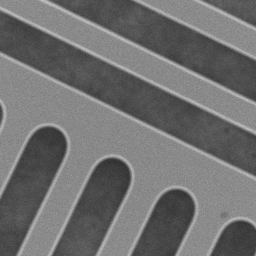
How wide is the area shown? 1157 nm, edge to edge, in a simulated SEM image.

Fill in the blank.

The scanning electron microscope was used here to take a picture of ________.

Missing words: groups of lines, slits or small figures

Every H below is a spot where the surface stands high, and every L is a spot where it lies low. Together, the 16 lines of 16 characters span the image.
HHHHLLLLLHHHHLLL
LLHHHHLLLLLHHHHL
LLLLHHHHLLLLLHHH
LLLLLLHHHHLLLLLL
HHLLLLLLHHHHLLLL
HHHHHLLLLLHHHHLL
HHHHHHHLLLLLHHHH
HHHHHHHHHLLLLLHH
HHLLHHHHHHHLLLLL
HLLLHHHHHHHHHLLL
HLLLHHLLHHHHHHHL
LLLHHLLLHHHHHHHH
LLLHHLLLHHLLHHHH
LLHHLLLHHLLLHHHH
LLHHLLLHHLLLHHLL
LHHLLLHHLLLHHLLL